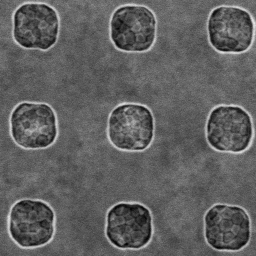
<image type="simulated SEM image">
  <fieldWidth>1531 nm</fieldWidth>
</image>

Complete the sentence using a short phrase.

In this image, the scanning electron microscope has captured a regular array of holes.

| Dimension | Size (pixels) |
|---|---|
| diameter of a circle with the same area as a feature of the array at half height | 46.8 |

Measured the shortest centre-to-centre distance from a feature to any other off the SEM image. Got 584 nm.